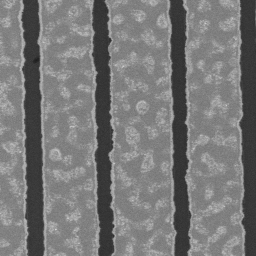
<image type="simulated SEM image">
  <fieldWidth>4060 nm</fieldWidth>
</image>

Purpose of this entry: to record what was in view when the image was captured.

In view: one or a few lines or trenches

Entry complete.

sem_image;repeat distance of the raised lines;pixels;72.9